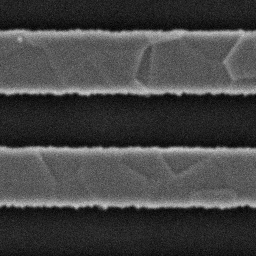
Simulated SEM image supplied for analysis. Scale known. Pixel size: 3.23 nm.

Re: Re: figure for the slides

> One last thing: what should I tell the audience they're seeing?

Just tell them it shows lines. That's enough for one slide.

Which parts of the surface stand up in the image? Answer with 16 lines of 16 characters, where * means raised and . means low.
................
................
****************
****************
****************
****************
................
................
................
****************
****************
****************
****************
................
................
................